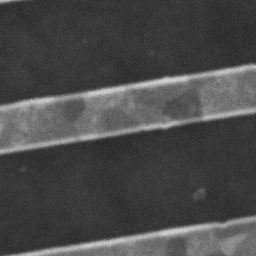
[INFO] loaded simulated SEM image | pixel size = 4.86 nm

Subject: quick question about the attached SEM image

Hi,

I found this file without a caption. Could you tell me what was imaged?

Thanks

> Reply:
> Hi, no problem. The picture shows one or a few lines or trenches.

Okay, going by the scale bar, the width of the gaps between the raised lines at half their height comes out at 515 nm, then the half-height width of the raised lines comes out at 213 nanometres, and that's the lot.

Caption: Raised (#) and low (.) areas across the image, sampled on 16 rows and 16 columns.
................
................
................
................
..............##
........########
.###############
############....
######..........
................
................
................
................
................
..........######
....############